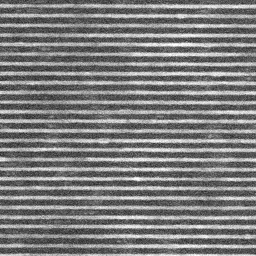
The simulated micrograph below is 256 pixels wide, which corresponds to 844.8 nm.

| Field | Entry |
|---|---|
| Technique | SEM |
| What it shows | parallel lines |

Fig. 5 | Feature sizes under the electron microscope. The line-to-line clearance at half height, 23.1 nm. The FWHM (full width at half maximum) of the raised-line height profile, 9.1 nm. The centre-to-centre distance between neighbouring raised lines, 31.7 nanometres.